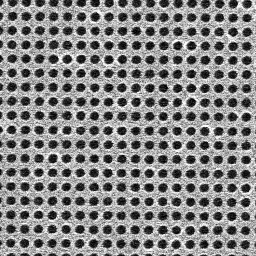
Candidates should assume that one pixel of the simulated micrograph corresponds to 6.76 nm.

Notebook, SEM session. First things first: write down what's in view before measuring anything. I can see a regular array of holes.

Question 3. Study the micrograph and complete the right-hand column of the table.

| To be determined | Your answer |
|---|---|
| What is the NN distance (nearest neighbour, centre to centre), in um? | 0.0923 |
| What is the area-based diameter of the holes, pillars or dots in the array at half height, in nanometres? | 63.3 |